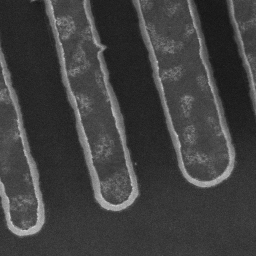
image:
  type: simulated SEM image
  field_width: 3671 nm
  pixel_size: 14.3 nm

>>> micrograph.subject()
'one or a few lines or trenches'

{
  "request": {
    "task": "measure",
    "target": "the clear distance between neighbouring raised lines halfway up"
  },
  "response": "699 nm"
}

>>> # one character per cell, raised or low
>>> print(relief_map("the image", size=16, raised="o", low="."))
...ooo...ooo..oo
...ooo...ooo...o
....oo...oooo..o
....oo...oooo..o
....ooo...ooo...
o...ooo...ooo...
o....oo...oooo..
o....oo...oooo..
o....ooo...ooo..
oo...ooo...ooo..
oo....oo...ooo..
oo....oo........
ooo...oo........
ooo.............
.o..............
................